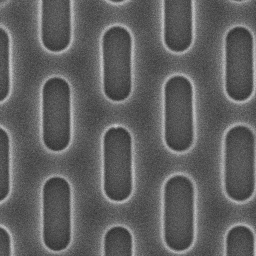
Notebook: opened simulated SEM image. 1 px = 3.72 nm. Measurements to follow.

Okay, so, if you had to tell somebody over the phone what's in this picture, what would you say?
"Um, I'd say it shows groups of lines, slits or small figures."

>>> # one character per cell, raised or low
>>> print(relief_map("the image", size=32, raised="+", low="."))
+++++....+++++++++++....++++++++
+++++....+++++++++++....++++++++
+++++....+++++++++++....++++++++
+++++....+++++..++++....+++++..+
.++++....++++...++++....++++....
.++++....++++....++++...++++....
.++++++++++++....+++++.+++++....
.++++++++++++...++++++++++++....
.++++++++++++...++++++++++++....
.++++++++++++...++++++.+++++....
.+++++...++++...+++++...++++....
.++++....++++...++++....++++....
+++++....+++++.+++++....+++++..+
+++++....++++++++++++...++++++++
+++++....++++++++++++...++++++++
+++++....++++++++++++...++++++++
.++++....++++...+++++...++++....
.++++....++++...+++++...++++....
.+++++..+++++....++++...++++....
.++++++++++++....+++++++++++....
.++++++++++++....+++++++++++....
.++++++++++++....+++++++++++....
.+++++..+++++....++++...++++....
.++++....++++....+++....++++....
.++++....++++...++++....++++...+
+++++....+++++++++++....++++++++
+++++....+++++++++++....++++++++
+++++....+++++++++++....++++++++
+++++....+++++..++++....+++++..+
.++++....++++...++++....++++....
.+++++...++++....++++...++++....
.++++++++++++....+++++++++++....